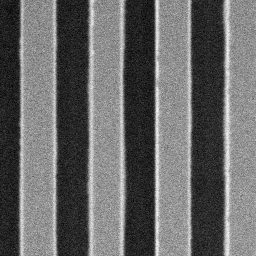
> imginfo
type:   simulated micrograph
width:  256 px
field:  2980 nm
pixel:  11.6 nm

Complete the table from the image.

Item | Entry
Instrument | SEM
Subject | lines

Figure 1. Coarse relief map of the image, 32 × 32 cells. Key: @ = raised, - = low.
---@@@@----@@@@-----@@@@----@@@@
---@@@@----@@@@-----@@@@----@@@@
---@@@@----@@@@-----@@@@----@@@@
---@@@@----@@@@-----@@@@----@@@@
---@@@@----@@@@-----@@@@----@@@@
---@@@@----@@@@-----@@@@----@@@@
---@@@@----@@@@-----@@@@----@@@@
---@@@@----@@@@-----@@@@----@@@@
---@@@@----@@@@-----@@@@----@@@@
---@@@@----@@@@-----@@@@----@@@@
---@@@@----@@@@-----@@@@----@@@@
---@@@@----@@@@-----@@@@----@@@@
---@@@@----@@@@-----@@@@----@@@@
---@@@@----@@@@-----@@@@----@@@@
---@@@@----@@@@-----@@@@----@@@@
---@@@@----@@@@-----@@@@----@@@@
---@@@@----@@@@-----@@@@----@@@@
---@@@@----@@@@-----@@@@----@@@@
---@@@@----@@@@-----@@@@----@@@@
---@@@@----@@@@-----@@@@----@@@@
---@@@@----@@@@-----@@@@----@@@@
---@@@@----@@@@-----@@@@----@@@@
---@@@@----@@@@-----@@@@----@@@@
---@@@@----@@@@-----@@@@----@@@@
---@@@@----@@@@-----@@@@----@@@@
---@@@@----@@@@-----@@@@----@@@@
---@@@@----@@@@-----@@@@----@@@@
---@@@@----@@@@-----@@@@----@@@@
---@@@@----@@@@-----@@@@----@@@@
---@@@@----@@@@-----@@@@----@@@@
---@@@@----@@@@-----@@@@----@@@@
---@@@@----@@@@-----@@@@----@@@@